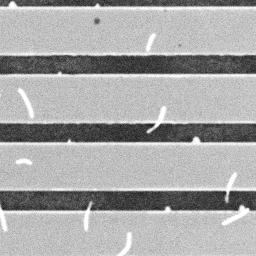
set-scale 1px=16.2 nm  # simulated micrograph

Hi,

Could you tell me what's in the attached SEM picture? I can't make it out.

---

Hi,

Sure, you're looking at lines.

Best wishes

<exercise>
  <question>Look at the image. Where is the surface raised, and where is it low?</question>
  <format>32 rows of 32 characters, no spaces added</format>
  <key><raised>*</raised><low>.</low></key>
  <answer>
................................
********************************
********************************
********************************
********************************
********************************
********************************
................................
................................
********************************
********************************
********************************
********************************
********************************
********************************
...................*............
................................
................................
********************************
********************************
********************************
********************************
********************************
********************************
................................
................................
********************************
********************************
********************************
********************************
********************************
********************************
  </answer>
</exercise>